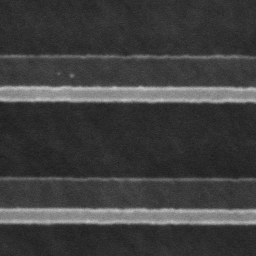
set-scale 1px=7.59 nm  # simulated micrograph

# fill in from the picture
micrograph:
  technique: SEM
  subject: lines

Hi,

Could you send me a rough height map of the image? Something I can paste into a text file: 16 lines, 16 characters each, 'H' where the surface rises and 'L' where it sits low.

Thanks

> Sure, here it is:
LLLLLLLLLLLLLLLL
LLLLLLLLLLLLLLLL
LLLLLLLLLLLLLLLL
HHLLHHLLLLLLLLLL
HHHHHHHHHHHHHHHH
HHHHHHHHHHHHHHHH
LLLLLLLLLLLLLLLL
LLLLLLLLLLLLLLLL
LLLLLLLLLLLLLLLL
LLLLLLLLLLLLLLLL
LLLLLLLLLLLLLLLL
HHHHHHHHHHHHHHHH
HHHHHHHHHHHHHHHH
HHHHHHHHHHHHHHHH
LLLLLLLLLLLLLLLL
LLLLLLLLLLLLLLLL